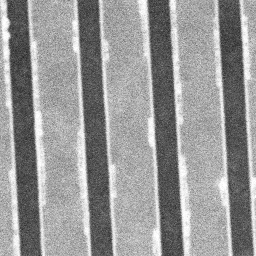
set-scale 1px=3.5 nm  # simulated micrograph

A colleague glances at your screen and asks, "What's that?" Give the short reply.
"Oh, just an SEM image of one or a few lines or trenches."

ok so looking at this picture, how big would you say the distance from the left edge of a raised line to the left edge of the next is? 247 nanometers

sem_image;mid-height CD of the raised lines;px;45.9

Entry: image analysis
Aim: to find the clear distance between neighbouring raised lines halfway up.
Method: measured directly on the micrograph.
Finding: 87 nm